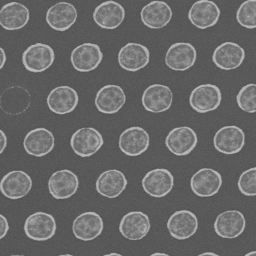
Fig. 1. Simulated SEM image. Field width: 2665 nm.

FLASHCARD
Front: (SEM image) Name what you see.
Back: a regular array of raised bodies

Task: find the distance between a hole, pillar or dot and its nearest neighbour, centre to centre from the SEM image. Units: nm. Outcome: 493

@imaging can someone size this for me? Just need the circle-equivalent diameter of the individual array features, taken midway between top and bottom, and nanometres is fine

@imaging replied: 289